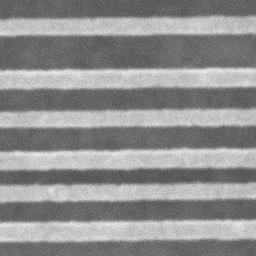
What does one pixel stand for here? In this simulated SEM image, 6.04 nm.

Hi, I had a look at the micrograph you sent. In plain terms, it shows lines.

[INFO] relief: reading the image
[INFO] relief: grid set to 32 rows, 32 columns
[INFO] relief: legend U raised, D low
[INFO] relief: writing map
DDDDDDDDDDDDDDDDDDDDDDDDDDDDDDDD
DDDDDDDDDDDDDDDDDDDDDDDDDDDDDDDD
DUUUUUUUUUUUUUUUUUUUUUUUUUUUUUUU
UUUUUUUUUUUUUUUUUUUUUUUUUUUUUUUU
DDDDDDDDDDDDDDDDDDDDDDDDDDDDDDDD
DDDDDDDDDDDDDDDDDDDDDDDDDDDDDDDD
DDDDDDDDDDDDDDDDDDDDDDDDDDDDDDDD
DDDDDDDDDDDDDDDDDDDDDDDDDDDDDDDD
DDDDDDDDDDDDDDDDDDDDDDDDDDDDDDDD
UUUUUUUUUUUUUUUUUUUUUUUUUUUUUUUU
UUUUUUUUUUUUUUUUUUUUUUUUUUUUUUUU
DDDDDDDDDDDDDDDDDDDDDDDDDDDDDDDD
DDDDDDDDDDDDDDDDDDDDDDDDDDDDDDDD
DDDDDDDDDDDDDDDDDDDDDDDDDDDDDDDD
UUUUUUUUUUUUUUUUUUUUUUUUUUUUUUUU
UUUUUUUUUUUUUUUUUUUUUUUUUUUUUUUU
DDDDDDDDDDDDDDDDDDDDDDDDDDDDDDDD
DDDDDDDDDDDDDDDDDDDDDDDDDDDDDDDD
DDDDDDDDDDDDDDDDDDDDDDDDDDDDDDDD
UUUUUUUUUUUUUUUUUUUUUUUUUUUUUUUU
UUUUUUUUUUUUUUUUUUUUUUUUUUUUUUUU
DDDDDDDDDDDDDDDDDDDDDDDDDDDDDDDD
DDDDDDDDDDDDDDDDDDDDDDDDDDDDDDDD
UUUUUUUUUUUUUUUUUUUUUUUUUUUUUUUU
UUUUUUUUUUUUUUUUUUUUUUUUUUUUUUUU
DDDDDDDDDDDDDDDDDDDDDDDDDDDDDDDD
DDDDDDDDDDDDDDDDDDDDDDDDDDDDDDDD
DDDDDDDDDDDDDDDDDDDDDDDDDDDDDDDD
UUUUUUUUUUUUUUUUUUUUUUUUUUUUUUUU
UUUUUUUUUUUUUUUUUUUUUUUUUUUUUUUU
DDDDDDDDDDDDDDDDDDDDDDDDDDDDDDDD
DDDDDDDDDDDDDDDDDDDDDDDDDDDDDDDD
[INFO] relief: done